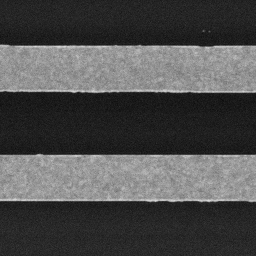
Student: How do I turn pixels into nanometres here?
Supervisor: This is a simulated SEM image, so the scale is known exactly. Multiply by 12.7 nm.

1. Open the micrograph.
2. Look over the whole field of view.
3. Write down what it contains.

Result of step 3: lines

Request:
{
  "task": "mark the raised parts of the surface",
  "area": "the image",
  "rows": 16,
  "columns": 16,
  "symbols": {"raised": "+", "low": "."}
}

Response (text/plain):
................
................
................
++++++++++++++++
++++++++++++++++
++++++++++++++++
................
................
................
................
++++++++++++++++
++++++++++++++++
++++++++++++++++
................
................
................